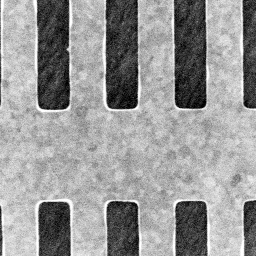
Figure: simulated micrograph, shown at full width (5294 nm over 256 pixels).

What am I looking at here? groups of lines, slits or small figures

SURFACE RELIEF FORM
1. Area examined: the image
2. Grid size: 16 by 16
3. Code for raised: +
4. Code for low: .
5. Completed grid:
++..+++..++..++.
++..+++..++..++.
++..+++..++..++.
++..++...++..++.
++..+++..++..++.
++..++...++..++.
++..+++..++..++.
++++++++++++++++
++++++++++++++++
++++++++++++++++
++++++++++++++++
++++++++++++++++
++++++++++++++++
++..+++..++..++.
++..+++..++..++.
++..+++..++..++.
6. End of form